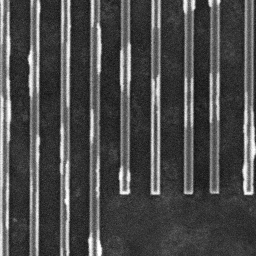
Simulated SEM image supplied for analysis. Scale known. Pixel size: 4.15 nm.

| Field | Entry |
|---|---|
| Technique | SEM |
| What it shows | parallel lines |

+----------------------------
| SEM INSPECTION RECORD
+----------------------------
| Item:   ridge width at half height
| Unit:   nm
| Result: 35.3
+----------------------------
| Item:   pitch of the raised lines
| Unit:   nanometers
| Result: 126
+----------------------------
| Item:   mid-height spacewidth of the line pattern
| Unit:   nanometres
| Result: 89.2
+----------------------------